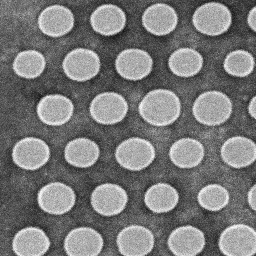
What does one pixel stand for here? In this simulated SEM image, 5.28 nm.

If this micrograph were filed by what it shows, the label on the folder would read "a regular array of raised bodies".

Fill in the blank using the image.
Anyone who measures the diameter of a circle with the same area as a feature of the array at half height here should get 32.4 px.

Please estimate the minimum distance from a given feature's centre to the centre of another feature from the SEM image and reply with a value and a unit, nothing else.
270 nm